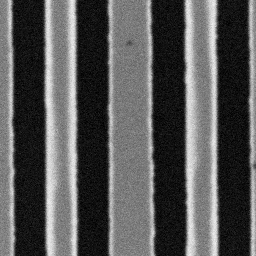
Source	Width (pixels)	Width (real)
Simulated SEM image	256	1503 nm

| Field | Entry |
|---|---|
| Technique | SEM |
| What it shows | lines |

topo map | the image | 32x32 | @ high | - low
@-----@@@-----@@@@@----@@@@----@
@-----@@@-----@@@@@----@@@@----@
@-----@@@-----@@@@@----@@@@----@
@-----@@@-----@@@@@----@@@@----@
@-----@@@-----@@@@@----@@@@----@
@-----@@@-----@@@@@----@@@@----@
@@----@@@-----@@@@@----@@@@----@
@@----@@@-----@@@@@----@@@@----@
@@----@@@-----@@@@@----@@@@----@
@@----@@@-----@@@@@----@@@@----@
@@----@@@-----@@@@@----@@@@----@
@@----@@@-----@@@@@-----@@@----@
@@----@@@-----@@@@@-----@@@----@
@@----@@@-----@@@@@-----@@@----@
@@----@@@-----@@@@@-----@@@----@
@@----@@@-----@@@@@-----@@@----@
@@----@@@-----@@@@@-----@@@----@
@@----@@@-----@@@@@-----@@@----@
@@----@@@-----@@@@@-----@@@----@
@@----@@@-----@@@@@-----@@@----@
@@----@@@-----@@@@@-----@@@----@
@@----@@@-----@@@@@-----@@@----@
@@----@@@-----@@@@@-----@@@----@
@@----@@@-----@@@@@-----@@@----@
@@----@@@-----@@@@@-----@@@----@
@@----@@@-----@@@@@-----@@@----@
@@----@@@-----@@@@@-----@@@----@
@@----@@@@----@@@@@-----@@@----@
@@----@@@@----@@@@@-----@@@----@
@@----@@@@----@@@@@-----@@@----@
@@----@@@@----@@@@@-----@@@----@
@@----@@@@----@@@@@-----@@@----@